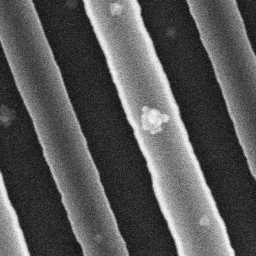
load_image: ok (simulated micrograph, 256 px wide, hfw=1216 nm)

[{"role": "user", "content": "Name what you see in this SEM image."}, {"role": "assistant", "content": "lines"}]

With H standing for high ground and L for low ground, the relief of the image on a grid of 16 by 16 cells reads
HHLLLHHHHLLLHHHL
HHHLLLHHHLLLHHHL
HHHLLLHHHLLLLHHH
HHHLLLLHHHLLLHHH
LHHHLLLHHHLLLHHH
LHHHLLLHHHHLLLHH
LLHHLLLLHHHLLLHH
LLHHHLLLHHHLLLHH
LLHHHLLLLHHHLLLH
LLLHHHLLLHHHLLLH
LLLHHHLLLHHHLLLL
LLLLHHLLLLHHHLLL
HLLLHHHLLLHHHLLL
HLLLHHHLLLHHHHLL
HLLLLHHLLLLHHHLL
HHLLLHHHLLLHHHLL